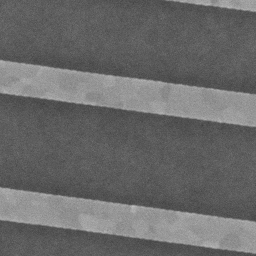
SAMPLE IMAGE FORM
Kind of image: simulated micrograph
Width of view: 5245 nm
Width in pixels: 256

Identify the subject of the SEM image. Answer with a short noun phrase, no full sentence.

lines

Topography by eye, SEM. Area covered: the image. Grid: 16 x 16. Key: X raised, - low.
---------------X
----------------
----------------
----------------
XXXXX-----------
XXXXXXXXXXXXX---
------XXXXXXXXXX
-------------XXX
----------------
----------------
----------------
----------------
XXXXXX----------
XXXXXXXXXXXXX---
------XXXXXXXXXX
--------------XX